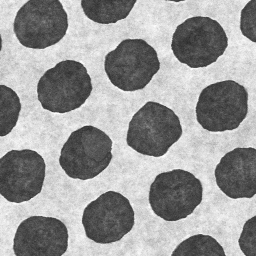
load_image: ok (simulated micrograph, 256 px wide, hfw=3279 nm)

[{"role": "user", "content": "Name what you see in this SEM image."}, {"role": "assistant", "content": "a regular array of holes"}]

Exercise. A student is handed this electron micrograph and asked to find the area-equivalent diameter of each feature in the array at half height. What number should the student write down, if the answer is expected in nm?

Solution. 674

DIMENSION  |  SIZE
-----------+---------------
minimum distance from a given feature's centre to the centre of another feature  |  0.877 micrometres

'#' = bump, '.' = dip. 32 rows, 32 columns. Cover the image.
###.....##.......##############.
##......###.....##############..
##......###....########....###..
##......##############......##..
##......##############......###.
###....########....##.......####
##############......##......####
#############.......##.....#####
######.....##.......############
#####......##......#############
#####......###....#########...##
..###......##############......#
..###......##############......#
...##.....########...###.......#
..###############.....###......#
..##############.......##.....##
.########....###.......#########
########......##......##########
########......###....#########..
.....##.......#####.########....
......#.......#############.....
......##.....########...###.....
.....##############......##.....
.....##############......##.....
....########...####......###....
###########.....###......#######
##########.......##.....########
###....###.......####.#########.
##......##.......#############..
##.......##....#########..####..
##......##############.....###..
##......##############......##..